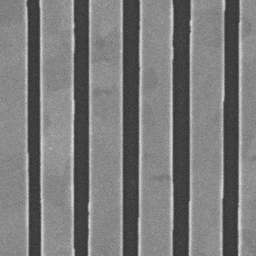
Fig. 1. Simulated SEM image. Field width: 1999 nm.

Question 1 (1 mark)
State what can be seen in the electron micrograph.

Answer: lines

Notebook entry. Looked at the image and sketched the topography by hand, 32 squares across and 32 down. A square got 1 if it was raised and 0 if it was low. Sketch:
11100111100111100011100011110011
11100111100111100011100011110011
11100111100111100011100011110011
11100111100111100011100011110011
11100111100111100011100011110011
11100111100111100011100011110011
11100111100111100011100011110011
11100111100111100011100011110011
11100111100111100011100011110011
11100111100111100011100011110011
11100111100111100011100011110011
11100111100111100011100011110011
11100111100111100011100011110011
11100111100111100111100011110011
11100111100111100011100011110011
11100111100111100011100011110011
11100111100111100011100011110011
11100111100111100011100011110011
11100111100111100011100011110011
11100111100111100111100011110011
11100111100111100111100011110011
11100111100111100111100011110011
11100111100111100111100011110011
11100111100111100111100011110011
11100111100111100111100011110011
11100111100111100111100011110011
11100111100111100111100011110011
11100111100111100111100011110011
11100111100111100111100011110011
11100111100111100111100011110011
11100111100111100111100011110011
11100111100111100111100011110011